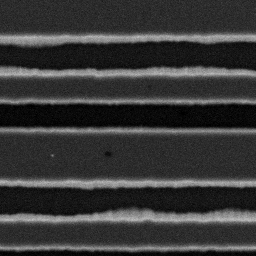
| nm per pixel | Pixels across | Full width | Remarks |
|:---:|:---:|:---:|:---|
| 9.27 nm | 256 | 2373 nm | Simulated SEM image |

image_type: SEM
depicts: lines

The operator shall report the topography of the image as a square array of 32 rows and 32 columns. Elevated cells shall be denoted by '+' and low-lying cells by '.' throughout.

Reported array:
++++++++++++++++++++++++++++++++
++++++++++++++++++++++++++++++++
++++++++++++++++++++++++++++++++
++++++++++++++++++++++++++++++++
++++++++++++++++++++++++++++++++
................................
................................
................................
................................
++++++++++++++++++++++++++++++++
++++++++++++++++++++++++++++++++
++++++++++++++++++++++++++++++++
++++++++++++++++++++++++++++++++
................................
................................
................................
++++++++++++++++++++++++++++++++
++++++++++++++++++++++++++++++++
++++++++++++++++++++++++++++++++
++++++++++++++++++++++++++++++++
++++++++++++++++++++++++++++++++
++++++++++++++++++++++++++++++++
++++++++++++++++++++++++++++++++
................................
................................
................................
................................
++++++++++++++++++++++++++++++++
++++++++++++++++++++++++++++++++
++++++++++++++++++++++++++++++++
++++++++++++++++++++++++++++++++
................................